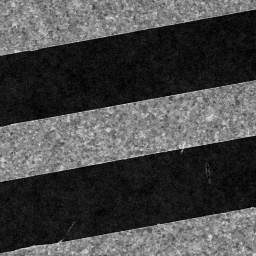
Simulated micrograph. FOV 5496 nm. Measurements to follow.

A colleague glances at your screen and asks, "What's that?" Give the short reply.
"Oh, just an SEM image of one or a few lines or trenches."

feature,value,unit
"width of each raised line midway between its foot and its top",1.16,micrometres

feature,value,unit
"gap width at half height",1510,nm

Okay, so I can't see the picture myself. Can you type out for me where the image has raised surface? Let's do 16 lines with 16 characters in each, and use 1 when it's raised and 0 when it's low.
1111111111111111
1111111111100000
1111100000000000
0000000000000000
0000000000000000
0000000000000111
0000000011111111
0011111111111111
1111111111111110
1111111111000000
1111100000000000
0000000000000000
0000000000000000
0000000000000111
0000000011111111
0011111111111111